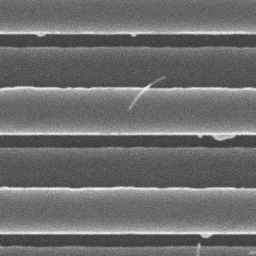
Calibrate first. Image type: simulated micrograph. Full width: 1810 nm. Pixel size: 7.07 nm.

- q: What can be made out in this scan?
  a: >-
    lines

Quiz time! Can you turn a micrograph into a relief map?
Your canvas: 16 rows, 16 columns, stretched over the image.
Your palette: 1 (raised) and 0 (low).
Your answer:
1111111111111111
1111111111111111
0000000000000000
0000000000000000
0000000000000000
0100000000000000
1111111111111111
1111111111111111
0000000000000000
0000000000000000
0000000000000000
0000000000000000
1111111111111111
1111111111111111
1111111111111111
0000000000000000